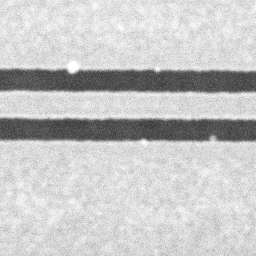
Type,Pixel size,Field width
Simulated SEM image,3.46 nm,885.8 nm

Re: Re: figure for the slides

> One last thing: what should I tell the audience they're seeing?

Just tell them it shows lines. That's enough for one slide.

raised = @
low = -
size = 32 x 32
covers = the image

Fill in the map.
@@@@@@@@@@@@@@@@@@@@@@@@@@@@@@@@
@@@@@@@@@@@@@@@@@@@@@@@@@@@@@@@@
@@@@@@@@@@@@@@@@@@@@@@@@@@@@@@@@
@@@@@@@@@@@@@@@@@@@@@@@@@@@@@@@@
@@@@@@@@@@@@@@@@@@@@@@@@@@@@@@@@
@@@@@@@@@@@@@@@@@@@@@@@@@@@@@@@@
@@@@@@@@@@@@@@@@@@@@@@@@@@@@@@@@
@@@@@@@@@@@@@@@@@@@@@@@@@@@@@@@@
@@-@@@@@@@@@@@@@@@@@@@@@@@@@@@@@
--------------------------------
--------------------------------
-@@@----------------------------
@@@@@@@@@@@@@@@@@@@@@@@@@@@@@@@@
@@@@@@@@@@@@@@@@@@@@@@@@@@@@@@@@
@@@@@@@@@@@@@@@@@@@@@@@@@@@@@@@@
--------------------------------
--------------------------------
--------------------------------
@@@@@@@@@@@@@@@@@@@@@@@@@@@@@@@@
@@@@@@@@@@@@@@@@@@@@@@@@@@@@@@@@
@@@@@@@@@@@@@@@@@@@@@@@@@@@@@@@@
@@@@@@@@@@@@@@@@@@@@@@@@@@@@@@@@
@@@@@@@@@@@@@@@@@@@@@@@@@@@@@@@@
@@@@@@@@@@@@@@@@@@@@@@@@@@@@@@@@
@@@@@@@@@@@@@@@@@@@@@@@@@@@@@@@@
@@@@@@@@@@@@@@@@@@@@@@@@@@@@@@@@
@@@@@@@@@@@@@@@@@@@@@@@@@@@@@@@@
@@@@@@@@@@@@@@@@@@@@@@@@@@@@@@@@
@@@@@@@@@@@@@@@@@@@@@@@@@@@@@@@@
@@@@@@@@@@@@@@@@@@@@@@@@@@@@@@@@
@@@@@@@@@@@@@@@@@@@@@@@@@@@@@@@@
@@@@@@@@@@@@@@@@@@@@@@@@@@@@@@@@